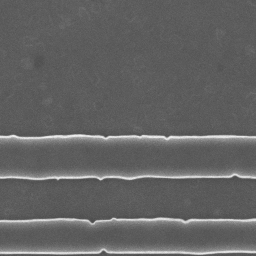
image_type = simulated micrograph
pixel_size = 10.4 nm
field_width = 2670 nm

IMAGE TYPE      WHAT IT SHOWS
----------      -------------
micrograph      one or a few lines or trenches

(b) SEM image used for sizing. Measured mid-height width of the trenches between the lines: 443 nm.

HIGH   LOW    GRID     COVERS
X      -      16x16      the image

----------------
----------------
----------------
----------------
----------------
----------------
----------------
----------------
X---XX----------
XXXXXXXXXXXXXXXX
XXXXXXXXXXXXXXXX
----------------
----------------
----------------
XXXXXXXXXXXXXXXX
XXXXXXXXXXXXXXXX